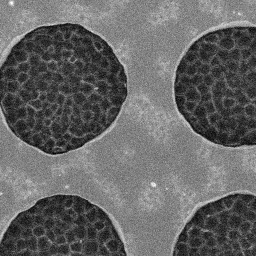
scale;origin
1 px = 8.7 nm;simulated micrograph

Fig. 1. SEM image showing holes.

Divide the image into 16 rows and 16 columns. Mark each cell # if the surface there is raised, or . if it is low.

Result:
################
####.###########
#.....######....
.......####.....
........###.....
........###.....
........###.....
.......#####....
#.....#######...
###.############
################
################
###..#########..
#......#####....
.......####.....
........###.....